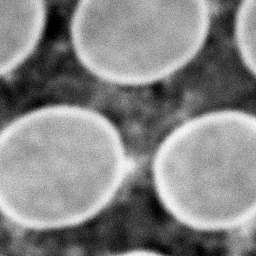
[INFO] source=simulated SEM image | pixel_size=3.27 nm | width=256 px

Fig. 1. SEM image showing raised bodies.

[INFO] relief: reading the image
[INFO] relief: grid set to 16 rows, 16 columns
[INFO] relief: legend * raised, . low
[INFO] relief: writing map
***..********..*
***..********..*
**...********..*
**...*******...*
......*****.....
................
................
.******.....****
*******....*****
********..******
********..******
*******...******
*******...******
.*****.....*****
................
................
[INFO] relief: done